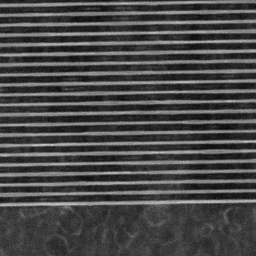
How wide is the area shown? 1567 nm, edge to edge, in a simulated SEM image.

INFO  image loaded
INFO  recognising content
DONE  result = parallel lines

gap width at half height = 7.5 px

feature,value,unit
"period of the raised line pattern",61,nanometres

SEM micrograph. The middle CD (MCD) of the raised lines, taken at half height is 0.0168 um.